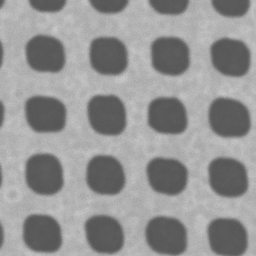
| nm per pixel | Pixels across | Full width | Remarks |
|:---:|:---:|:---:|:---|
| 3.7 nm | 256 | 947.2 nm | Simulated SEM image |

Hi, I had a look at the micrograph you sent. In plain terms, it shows a regular array of holes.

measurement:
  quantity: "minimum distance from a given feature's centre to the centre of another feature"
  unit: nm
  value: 219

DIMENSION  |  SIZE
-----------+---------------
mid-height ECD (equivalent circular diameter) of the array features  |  149 nm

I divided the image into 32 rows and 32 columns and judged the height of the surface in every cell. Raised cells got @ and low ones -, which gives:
@@@@----@@@-----@@@-----@@@----@
@@@@@--@@@@@---@@@@@---@@@@----@
@@@@@@@@@@@@@@@@@@@@@@@@@@@@@@@@
@@@@@@@@@@@@@@@@@@@@@@@@@@@@@@@@
@@@@--@@@@@@@@@@@@@@@@@@@@@@@@@@
@@@-----@@@----@@@@----@@@@----@
@@@-----@@@-----@@@-----@@-----@
@@@-----@@@-----@@@-----@@@----@
@@@@----@@@@----@@@-----@@@----@
@@@@@@@@@@@@@@@@@@@@@@@@@@@@@-@@
@@@@@@@@@@@@@@@@@@@@@@@@@@@@@@@@
@@@@@@@@@@@@@@@@@@@@@@@@@@@@@@@@
@@@@---@@@@----@@@@---@@@@@---@@
@@@-----@@@-----@@@----@@@-----@
@@@-----@@@-----@@-----@@@-----@
@@@@----@@@-----@@@----@@@-----@
@@@@@--@@@@@---@@@@@---@@@@----@
@@@@@@@@@@@@@@@@@@@@@@@@@@@@@@@@
@@@@@@@@@@@@@@@@@@@@@@@@@@@@@@@@
@@@@---@@@@@--@@@@@@@@@@@@@@@@@@
@@@-----@@@----@@@@----@@@----@@
@@@-----@@@-----@@-----@@@-----@
@@@-----@@@-----@@-----@@@-----@
@@@@----@@@----@@@@----@@@-----@
@@@@@@@@@@@@@@@@@@@@@@@@@@@@--@@
@@@@@@@@@@@@@@@@@@@@@@@@@@@@@@@@
@@@@@@@@@@@@@@@@@@@@@@@@@@@@@@@@
@@@----@@@@----@@@@---@@@@@---@@
@@@-----@@@----@@@-----@@@-----@
@@@-----@@@-----@@-----@@@-----@
@@@-----@@@-----@@@----@@@-----@
@@@@@--@@@@@---@@@@----@@@@----@